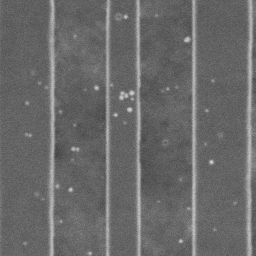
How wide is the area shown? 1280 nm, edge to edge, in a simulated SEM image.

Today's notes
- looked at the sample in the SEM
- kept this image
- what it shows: lines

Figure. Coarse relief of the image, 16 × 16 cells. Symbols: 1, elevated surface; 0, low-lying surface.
1110000110001111
1110000110001111
1110000110001111
1110000110001111
1110000110001111
1110000110001111
1110000110001111
1110000110001111
1110000110001111
1110000110001111
1110000110001111
1110000110001111
1110000110001111
1110000110001111
1110000110001111
1110000110001111